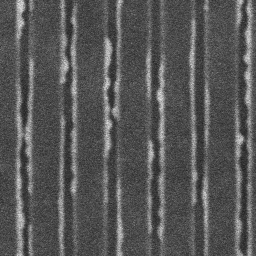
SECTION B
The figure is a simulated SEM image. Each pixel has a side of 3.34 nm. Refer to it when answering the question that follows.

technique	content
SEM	parallel lines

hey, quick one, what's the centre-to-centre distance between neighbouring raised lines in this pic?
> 147 nm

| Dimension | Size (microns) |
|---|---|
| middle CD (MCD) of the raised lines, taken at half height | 0.117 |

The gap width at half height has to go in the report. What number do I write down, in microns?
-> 0.0292